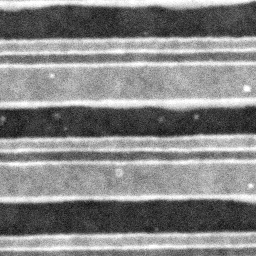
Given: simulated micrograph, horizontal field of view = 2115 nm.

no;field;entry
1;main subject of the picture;lines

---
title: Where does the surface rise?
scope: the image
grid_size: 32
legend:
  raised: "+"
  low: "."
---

+++.............................
................................
................................
................................
................................
++++++++++++++++++++++++++++++++
++++++++++++++++++++++++++++++++
++++++++++++++++++++++++++++++++
++++++++++++++++++++++++++++++++
++++++++++++++++++++++++++++++++
++++++++++++++++++++++++++++++++
++++++++++++++++++++++++++++++++
++++++++++++++++++++++++++++++++
................................
................................
................................
................................
......+.++++++++++++++++++++++++
++++++++++++++++++++++++++++++++
++++++++++++++++++++++++++++++++
++++++++++++++++++++++++++++++++
++++++++++++++++++++++++++++++++
++++++++++++++++++++++++++++++++
++++++++++++++++++++++++++++++++
++++++++++++++++++++++++++++++++
................................
................................
................................
................................
..............++++++++++++++++++
++++++++++++++++++++++++++++++++
++++++++++++++++++++++++++++++++